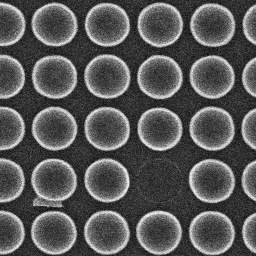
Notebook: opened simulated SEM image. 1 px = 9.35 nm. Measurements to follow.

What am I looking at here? a regular array of raised bodies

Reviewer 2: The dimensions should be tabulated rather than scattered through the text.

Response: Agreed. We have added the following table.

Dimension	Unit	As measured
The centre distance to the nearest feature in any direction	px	51.8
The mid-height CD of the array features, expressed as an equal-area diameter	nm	393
